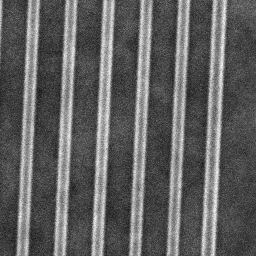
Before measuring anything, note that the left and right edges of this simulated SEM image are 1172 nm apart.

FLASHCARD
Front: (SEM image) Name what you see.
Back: parallel lines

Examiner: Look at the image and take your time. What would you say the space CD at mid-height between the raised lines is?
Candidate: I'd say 127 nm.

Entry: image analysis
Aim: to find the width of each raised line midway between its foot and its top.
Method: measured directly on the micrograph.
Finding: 0.0463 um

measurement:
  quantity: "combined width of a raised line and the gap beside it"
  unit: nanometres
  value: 170